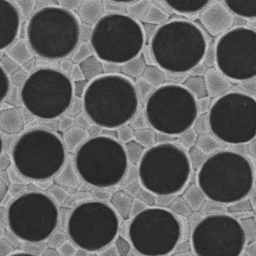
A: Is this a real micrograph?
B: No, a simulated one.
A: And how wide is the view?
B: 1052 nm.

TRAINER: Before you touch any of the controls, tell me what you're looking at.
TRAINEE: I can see a regular array of holes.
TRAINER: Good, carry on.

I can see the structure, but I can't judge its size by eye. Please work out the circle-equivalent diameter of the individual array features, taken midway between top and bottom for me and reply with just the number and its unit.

0.201 micrometres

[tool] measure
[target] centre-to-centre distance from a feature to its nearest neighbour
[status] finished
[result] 0.251 um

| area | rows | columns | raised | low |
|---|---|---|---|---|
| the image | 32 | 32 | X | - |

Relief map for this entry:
-XXXXXXXXXXXXXXXXXXXX-----XX----
--XXX---XXXXXXXXXXXXXXXXXXXXX---
--XX-----XXXX----XXXXXXXXXXXXXXX
--XX------XX-----XXX-----XXXXXXX
--XX------XX------X------XXX----
-XXX-----XXX------X-------X-----
XXXXX----XXX-----XX-------X-----
XXXXXXXXXXXXX---XXXX-----XX-----
XXXXXXXXXXXXXXXXXXXXX---XXXX----
-XXX----XXXXXXXXXXXXXXXXXXXXX---
-XX------XXX----XXXXXXXXXXXXXXXX
-XX------XX------XXX----XXXXXXXX
XXX------XX------XX-----XXX-----
XXX-----XXX------X------XXX-----
XXXXX--XXXX-----XX------XX------
XXXXXXXXXXXX---XXXX-----XX------
XXXX--XXXXXXXXXXXXXX---XXXX-----
XX-----XXXX---XXXXXXXXXXXXXX---X
XX------XX-----XXXX---XXXXXXXXXX
XX------XX------XX-----XXXX---XX
XX------XX------XX------XX-----X
XXX----XXX------X-------X------X
XXXXXXXXXXX----XXX-----XX------X
XXXXXXXXXXXXXXXXXX----XXX------X
XXX---XXXXXXXXXXXXXXXXXXXX-----X
XX-----XXX---XXXXXXXXXXXXXXXXXXX
X------XX-----XXXX---XXXXXXXXXXX
X------XX------XX-----XXXX---XXX
X------XX------X------XXX-----XX
XX----XXX-----XX------XX-------X
XXXXXXXXXX---XXXX-----XX------XX
XXXXXXXXXXXXXXXXXX---XXXX-----XX